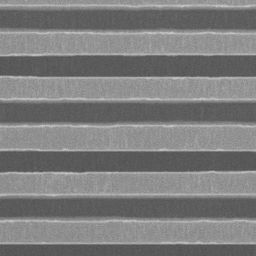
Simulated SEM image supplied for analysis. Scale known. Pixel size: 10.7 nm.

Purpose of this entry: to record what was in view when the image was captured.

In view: lines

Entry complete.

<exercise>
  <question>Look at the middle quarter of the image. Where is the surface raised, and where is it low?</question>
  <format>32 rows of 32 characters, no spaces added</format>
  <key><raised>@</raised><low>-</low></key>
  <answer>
--------------------------------
--------------------------------
--------------------------------
@@@@@@@@@@@@@@@@@@@@@@@@@@@@@@@@
@@@@@@@@@@@@@@@@@@@@@@@@@@@@@@@@
@@@@@@@@@@@@@@@@@@@@@@@@@@@@@@@@
@@@@@@@@@@@@@@@@@@@@@@@@@@@@@@@@
@@@@@@@@@@@@@@@@@@@@@@@@@@@@@@@@
@@@@@@@@@@@@@@@@@@@@@@@@@@@@@@@@
--------------------------------
--------------------------------
--------------------------------
--------------------------------
--------------------------------
--------------------------------
@@@@@@@@---@@@@@@@@@@@@@@@@@@@@@
@@@@@@@@@@@@@@@@@@@@@@@@@@@@@@@@
@@@@@@@@@@@@@@@@@@@@@@@@@@@@@@@@
@@@@@@@@@@@@@@@@@@@@@@@@@@@@@@@@
@@@@@@@@@@@@@@@@@@@@@@@@@@@@@@@@
@@@@@@@@@@@@@@@@@@@@@@@@@@@@@@@@
@@@@@@@@@@@@@@@@@@@@@@@@@@@@@@@@
--------------------------------
--------------------------------
--------------------------------
--------------------------------
--------------------------------
@@@@@@@@@@@@@@@@@@@@@@@@@@@@@@@@
@@@@@@@@@@@@@@@@@@@@@@@@@@@@@@@@
@@@@@@@@@@@@@@@@@@@@@@@@@@@@@@@@
@@@@@@@@@@@@@@@@@@@@@@@@@@@@@@@@
@@@@@@@@@@@@@@@@@@@@@@@@@@@@@@@@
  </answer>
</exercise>